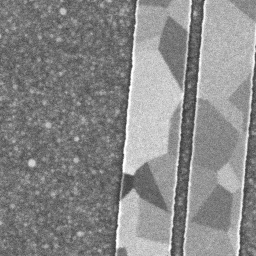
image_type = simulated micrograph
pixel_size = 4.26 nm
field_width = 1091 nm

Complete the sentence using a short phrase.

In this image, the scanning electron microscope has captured one or a few lines or trenches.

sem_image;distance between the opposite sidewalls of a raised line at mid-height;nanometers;232